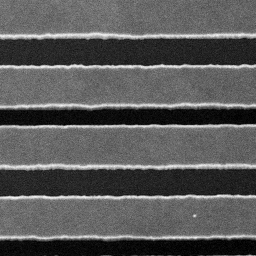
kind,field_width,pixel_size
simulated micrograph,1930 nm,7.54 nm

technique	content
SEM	lines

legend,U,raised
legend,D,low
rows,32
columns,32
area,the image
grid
UUUUUUUUUUUUUUUUUUUUUUUUUUUUUUUU
UUUUUUUUUUUUUUUUUUUUUUUUUUUUUUUU
UUUUUUUUUUUUUUUUUUUUUUUUUUUUUUUU
UUUUUUUUUUUUUUUUUUUUUUUUUUUUUUUU
UUUUUUUUUUUUUUUUUUUUUUUUUUUUUUUU
DDDDDDDDDDDDDDDDDDDDDDDDDDDDDDDD
DDDDDDDDDDDDDDDDDDDDDDDDDDDDDDDD
DDDDDDDDDDDDDDDDDDDDDDDDDDDDDDDD
UUUUUUUUUUUUUUUUUUUUUUUUUUUUUUUU
UUUUUUUUUUUUUUUUUUUUUUUUUUUUUUUU
UUUUUUUUUUUUUUUUUUUUUUUUUUUUUUUU
UUUUUUUUUUUUUUUUUUUUUUUUUUUUUUUU
UUUUUUUUUUUUUUUUUUUUUUUUUUUUUUUU
UUUUDDDDDDUUDDDDDDDDDDDDDDDDDDDD
DDDDDDDDDDDDDDDDDDDDDDDDDDDDDDDD
DDDDDDDDDDDDDDDDDDDDDDDDDDDDDDDD
UUUUUUUUUUUUUUUUUUUUUUUUUUUUUUUU
UUUUUUUUUUUUUUUUUUUUUUUUUUUUUUUU
UUUUUUUUUUUUUUUUUUUUUUUUUUUUUUUU
UUUUUUUUUUUUUUUUUUUUUUUUUUUUUUUU
UUUUUUUUUUUUUUUUUUUUUUUUUUUUUUUU
DDDDDDDDDDDDDDDDDDDDDDDDDDDDDDDD
DDDDDDDDDDDDDDDDDDDDDDDDDDDDDDDD
DDDDDDDDDDDDDDDDDDDDDDDDDDDDDDDD
DDDDDDDDDDDDDDDDDDDDDDDUUDDUUUDU
UUUUUUUUUUUUUUUUUUUUUUUUUUUUUUUU
UUUUUUUUUUUUUUUUUUUUUUUUUUUUUUUU
UUUUUUUUUUUUUUUUUUUUUUUUUUUUUUUU
UUUUUUUUUUUUUUUUUUUUUUUUUUUUUUUU
UUUUUUUUUUUUUUUUUUUUUUUUUUUUUUUU
DDDDDDDDDDDDDDDDDDDDDDDDDDDDDDDD
DDDDDDDDDDDDDDDDDDDDDDDDDDDDDDDD